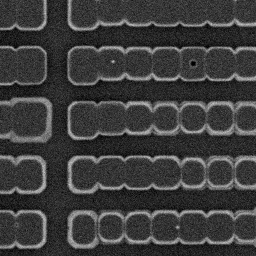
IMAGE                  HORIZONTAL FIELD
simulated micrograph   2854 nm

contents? wiring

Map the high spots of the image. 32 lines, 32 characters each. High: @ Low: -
@@@@@@---@@@@@@@@@@@@@@@@@@@@@@@
@@@@@@---@@@@@@@@@@@@@@@@@@@@@@@
@@@@@@---@@@@@@@@@@@@@@@@@@@@@@@
@-@@@----@@@--------------------
--------------------------------
--------------------------------
@@@@@@---@@@@@@@@@@@@@@@@@@@@@@@
@@@@@@---@@@@@@@@@@@@@@@@@@@@@@@
@@@@@@---@@@@@@@@@@@@@@@@@@@@@@@
@@@@@@---@@@@@@@@@@@@@@@@@@@@@@@
---------@@@--------------------
--------------------------------
--@@@---------------------------
@@@@@@---@@@@@@@@@@@@@@@@@@@@@@@
@@@@@@---@@@@@@@@@@@@@@@@@@@@@@@
@@@@@@---@@@@@@@@@@@@@@@@@@@@@@@
@@@@@@---@@@@@@@@@--@@-@@--@@-@@
--------------------------------
--------------------------------
--------------------------------
@@@@@----@@@@@@@@@@@@@@@@@@@@@@@
@@@@@@---@@@@@@@@@@@@@@@@@@@@@@@
@@@@@@---@@@@@@@@@@@@@@@@@@@@@@@
@@@@@----@@@----@@@-@@----------
--------------------------------
--------------------------------
@--@@---------------@--@@--@----
@@@@@@---@@@@@@@@@@@@@@@@@@@@@@@
@@@@@@---@@@@@@@@@@@@@@@@@@@@@@@
@@@@@@---@@@@@@@@@@@@@@@@@@@@@@@
@@@@@----@@@--------------------
--------------------------------